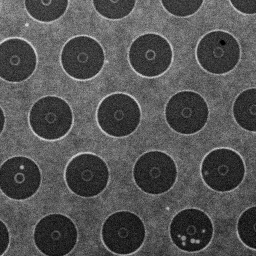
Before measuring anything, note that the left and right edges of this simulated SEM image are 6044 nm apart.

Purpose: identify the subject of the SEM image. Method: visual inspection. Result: an array of small figures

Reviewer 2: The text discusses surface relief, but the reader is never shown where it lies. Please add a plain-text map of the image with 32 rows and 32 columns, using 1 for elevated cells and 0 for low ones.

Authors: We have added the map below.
11100000111100000111000001111000
11100000111100001111100011111100
11111001111111111111111111111111
11111111111111111111111111111111
11111111110111111000111110000111
00001111000011110000011110000011
00001111000001110000001100010011
01000111001001110000001110000011
00001111000001111000011110000111
00001111100011111100111111111111
11111111111111111111111111111111
11111111111111111111110011111100
11111000111110000111100000111000
11110000011100000111100000111001
01110010011100100011100000111000
01110000011100000111100000111100
11110000011110000111110001111111
11111101111111111111111111111111
11111111111111111111111111111111
11011111100011111100011111000011
00000111000001111000001110000001
00000111000000111001001110010001
00100111000000111000001110000011
00000111100001111000011111000111
10001111110011111111111111111111
11111111111111111111111111111111
11111111111111001111110001111100
11111000011110000011110000111100
01110000001110000011100000011100
01110000001110010011100000011100
01110000011110000011110000111110
01111000011111000111111111111111